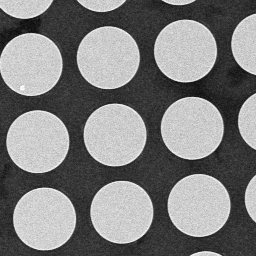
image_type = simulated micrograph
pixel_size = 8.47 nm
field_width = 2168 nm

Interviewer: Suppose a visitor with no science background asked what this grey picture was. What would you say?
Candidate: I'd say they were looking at an array of small figures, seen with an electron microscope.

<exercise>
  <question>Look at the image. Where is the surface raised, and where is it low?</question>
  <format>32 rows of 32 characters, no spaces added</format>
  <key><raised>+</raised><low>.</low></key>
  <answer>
++++++....+++++......++.........
.+++++..........................
.......................+......++
............+++......+++++...+++
..+++......+++++....+++++++..+++
.++++++...+++++++..++++++++..+++
+++++++...+++++++..++++++++..+++
++++++++..+++++++..++++++++..+++
++++++++..+++++++...++++++....++
++++++++..+++++++....++++.......
.++++++....+++++................
..++++..........................
......................++++.....+
............++++.....++++++...++
..+++++....++++++...++++++++..++
.+++++++...+++++++..++++++++..++
.+++++++..++++++++..++++++++..++
.++++++++..+++++++..++++++++...+
.++++++++..+++++++...++++++.....
.+++++++....+++++.....++++......
..+++++......+++................
....++..........................
.......................++++....+
.....+.......+++++....++++++...+
...+++++....+++++++..++++++++..+
..+++++++..++++++++..++++++++..+
..+++++++..++++++++..++++++++..+
..+++++++..++++++++..+++++++....
..+++++++...+++++++...++++++....
..+++++++....+++++......++......
...+++++........................
.........................++.....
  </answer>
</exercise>